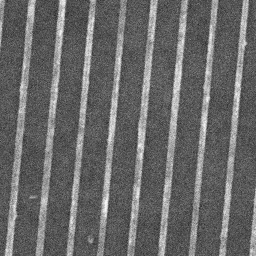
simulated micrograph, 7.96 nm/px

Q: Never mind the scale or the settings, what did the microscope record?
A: parallel lines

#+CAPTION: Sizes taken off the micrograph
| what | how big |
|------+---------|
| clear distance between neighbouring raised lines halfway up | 24.2 px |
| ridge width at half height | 45.6 nanometers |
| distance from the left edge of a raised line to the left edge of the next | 242 nm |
